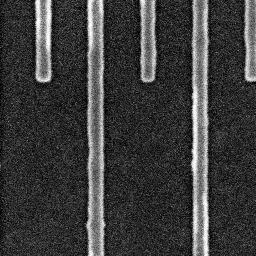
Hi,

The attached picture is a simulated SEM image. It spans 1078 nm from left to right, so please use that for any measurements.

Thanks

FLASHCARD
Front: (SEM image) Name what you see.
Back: parallel lines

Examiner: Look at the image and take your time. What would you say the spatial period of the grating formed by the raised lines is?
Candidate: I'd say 0.22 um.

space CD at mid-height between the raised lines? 0.161 µm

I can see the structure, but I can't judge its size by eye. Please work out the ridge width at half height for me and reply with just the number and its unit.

57.8 nm